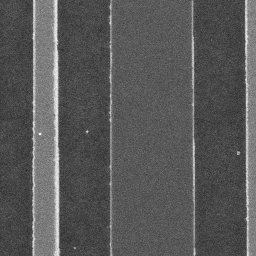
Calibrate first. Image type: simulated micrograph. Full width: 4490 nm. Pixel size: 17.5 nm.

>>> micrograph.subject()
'lines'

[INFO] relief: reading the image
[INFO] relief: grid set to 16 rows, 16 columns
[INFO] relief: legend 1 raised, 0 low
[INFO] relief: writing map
0011000111110001
0011000111110001
0011000111110001
0011000111110001
0011000111110001
0011000111110001
0011000111110001
0011000111110001
0011000111110001
0011000111110001
0011000111110001
0011000111110001
0011000111110001
0011000111110001
0011000111110001
0011000111110001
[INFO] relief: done